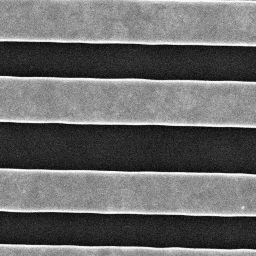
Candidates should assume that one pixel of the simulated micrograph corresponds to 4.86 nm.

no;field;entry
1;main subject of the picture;groups of lines, slits or small figures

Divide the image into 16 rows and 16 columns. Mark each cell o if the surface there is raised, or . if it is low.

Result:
oooooooooooooooo
oooooooooooooooo
oooooooooooooooo
................
................
oooooooooooooooo
oooooooooooooooo
oooooooooooooooo
................
................
................
oooooooooooooooo
oooooooooooooooo
................
................
oooooooo........